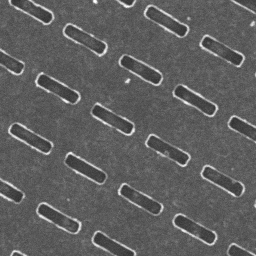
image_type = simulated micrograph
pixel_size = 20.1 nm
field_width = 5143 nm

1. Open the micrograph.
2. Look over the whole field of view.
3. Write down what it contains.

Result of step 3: a regular array of holes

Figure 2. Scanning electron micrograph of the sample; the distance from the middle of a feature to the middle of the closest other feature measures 56.4 px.